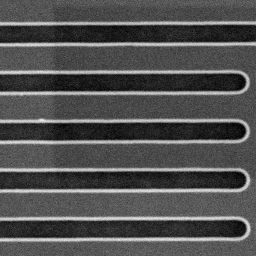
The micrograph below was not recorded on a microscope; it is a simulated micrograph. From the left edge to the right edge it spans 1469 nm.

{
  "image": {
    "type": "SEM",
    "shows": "groups of lines, slits or small figures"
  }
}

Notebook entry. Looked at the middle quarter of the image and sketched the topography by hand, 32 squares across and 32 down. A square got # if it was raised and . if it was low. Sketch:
################################
################################
................................
................................
................................
................................
................................
################################
################################
################################
################################
################################
################################
################################
................................
................................
................................
................................
................................
................................
################################
################################
################################
################################
################################
################################
###############........#####....
................................
................................
................................
................................
................................